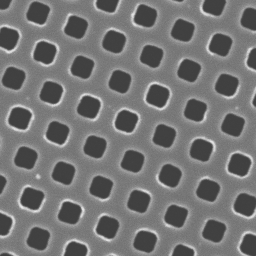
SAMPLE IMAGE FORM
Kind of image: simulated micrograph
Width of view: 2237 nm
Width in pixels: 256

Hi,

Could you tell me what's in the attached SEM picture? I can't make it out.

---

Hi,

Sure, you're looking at a regular array of holes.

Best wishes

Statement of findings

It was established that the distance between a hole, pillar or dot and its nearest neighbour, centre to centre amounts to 351 nm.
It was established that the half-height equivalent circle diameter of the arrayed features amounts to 200 nm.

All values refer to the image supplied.